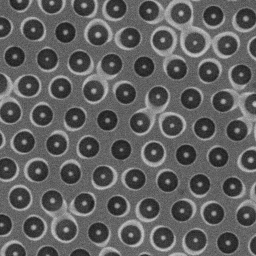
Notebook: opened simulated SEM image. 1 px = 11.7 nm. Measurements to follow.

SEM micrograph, an array of small figures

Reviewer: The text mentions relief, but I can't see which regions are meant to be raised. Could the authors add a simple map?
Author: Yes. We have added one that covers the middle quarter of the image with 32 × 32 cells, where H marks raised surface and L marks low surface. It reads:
HLLLLLLHHLLLLLLHHLLLLLLHHLLLLLLH
HHLLLLHHHLLLLLHHHHLLLLLHHLLLLLLH
HHHHHHHHHHLLLHHHHHLLLLHHHHLLLLLH
LHHHHHHLHHHHHHHHHHHHHHHHHHHLLLHH
LLHHHHLLLLHHHHHLHHHHHHHHHHHHHHHH
LLHHHLLLLLHHHLLLLHHHHHHHHHHHHHHH
LLHHHLLLLLHHHLLLLLHHHHLLLLHHHHLL
LLHHHLLLLLHHHLLLLLHHHLLLLLHHHLLL
HHHHHLLLLLHHHLLLLLHHHLLLLLHHHLLL
HHHHHHHLHHHHHHLLLHHHHLLLLLHHHLLL
HHHHHHHHHHHHHHHHHHHHHLLLLHHHHHLL
HLLLLHHHHHLHHHHHHHHHHHHHHHHHHHHH
LLLLLHHHHLLLLHHHHHLLLHHHHHLHHHHH
LLLLLLHHLLLLLHHHHLLLLLHHHLLLLHHH
LLLLLHHHLLLLLHHHLLLLLLHHLLLLLLHH
HLLLLHHHHLLLLHHHLLLLLLHHLLLLLLHH
HHHHHHHHHHLLHHHHHLLLLHHHHLLLLLHH
HHHHHHHHHHHHHHHHHHHHHHHHHLLLLHHH
HHHHHLLLHHHHHHHHHHHHHHHHHHHHHHHH
LHHHLLLLLHHHHLLLHHHHHHLHHHHHHHHH
LHHHLLLLLHHHLLLLLHHHLLLLLHHHHLLL
HHHHLLLLLHHHLLLLLHHHLLLLLHHHLLLL
HHHHLLLLHHHHLLLLLHHHLLLLLHHHLLLL
HHHHHHLHHHHHHLLLHHHHLLLLLHHHLLLL
HLHHHHHHHHHHHHHHHHHHHLLLHHHHHLLL
LLLLHHHHHLLHHHHHHHHHHHHHHHHHHHHH
LLLLHHHHLLLLHHHHLLLHHHHHHHHHHHHH
LLLLHHHLLLLLLHHLLLLLHHHHLLLLHHHH
LLLLHHHLLLLLLHHLLLLLHHHLLLLLHHHH
LLLHHHHLLLLLHHHLLLLLHHHLLLLLLHHL
HHHHHHHHLLLHHHHHLLLLHHHLLLLLHHHL
HHHHHHHHHHHHHHHHHHHHHHHHLLLLHHHH